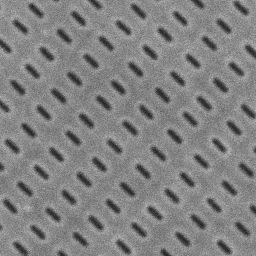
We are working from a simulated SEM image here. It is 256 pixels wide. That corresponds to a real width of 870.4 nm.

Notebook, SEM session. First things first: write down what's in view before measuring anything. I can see a regular array of holes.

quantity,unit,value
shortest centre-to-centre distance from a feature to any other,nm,77